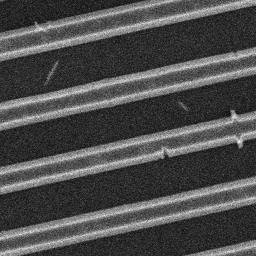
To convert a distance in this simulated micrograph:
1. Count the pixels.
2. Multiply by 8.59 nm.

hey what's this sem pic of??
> one or a few lines or trenches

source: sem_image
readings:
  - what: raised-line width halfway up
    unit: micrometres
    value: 0.169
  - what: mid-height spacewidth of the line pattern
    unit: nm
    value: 384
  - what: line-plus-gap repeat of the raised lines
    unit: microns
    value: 0.552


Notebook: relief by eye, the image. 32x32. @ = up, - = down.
------------------@@@@@@@@@@@@--
--------------@@@@@@@@@@@@------
---------@@@@@@@@@@@@-----------
----@@@@@@@@@@@@@---------------
@@@@@@@@@@@@--------------------
@@@@@@@@------------------------
@@@----------------------------@
---------------------------@@@@@
----------------------@@@@@@@@@@
------------------@@@@@@@@@@@---
-------------@@@@@@@@@@@--------
--------@@@@@@@@@@@@------------
----@@@@@@@@@@@-----------------
@@@@@@@@@@@---------------------
@@@@@@-----------------------@-@
@@-------------------------@@@@@
----------------------@@@@@@@@@@
------------------@@@@@@@@@@@@--
-------------@@@@@@@@@@@--------
---------@@@@@@@@@@-------------
----@@@@@@@@@@@-----------------
@@@@@@@@@@----------------------
@@@@@@--------------------------
@@-------------------------@@@@@
-----------------------@@@@@@@@@
-------------------@@@@@@@@@@@--
--------------@@@@@@@@@@@-------
---------@@@@@@@@@@@@-----------
-----@@@@@@@@@@@----------------
@@@@@@@@@@@---------------------
@@@@@@@-------------------------
@@-------------------------@@@@@